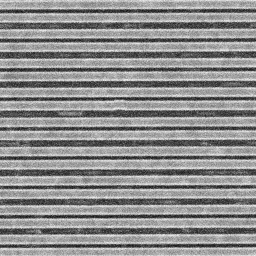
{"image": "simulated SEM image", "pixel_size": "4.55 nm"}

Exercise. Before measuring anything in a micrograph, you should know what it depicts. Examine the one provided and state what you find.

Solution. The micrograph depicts parallel lines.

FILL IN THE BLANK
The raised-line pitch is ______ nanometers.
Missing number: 66.9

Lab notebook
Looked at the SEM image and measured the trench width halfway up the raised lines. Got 24.4 nm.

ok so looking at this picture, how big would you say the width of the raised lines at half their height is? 8.11 px